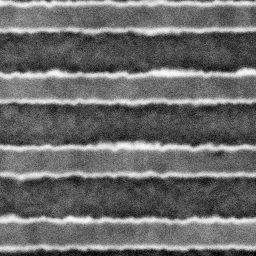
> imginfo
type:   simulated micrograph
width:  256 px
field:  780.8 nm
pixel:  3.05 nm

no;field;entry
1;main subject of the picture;lines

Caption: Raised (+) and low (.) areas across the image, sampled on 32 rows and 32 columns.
++++++++++++++++++++++++++++++++
++++++++++++++++++++++++++++++++
++++++++++++++++++++++++++++++++
++++++++++++++++++++++++++++++++
................................
................................
................................
................................
................................
++++++++++++++++++++++++++++++++
++++++++++++++++++++++++++++++++
++++++++++++++++++++++++++++++++
++++++++++++++++++++++++++++++++
................................
................................
................................
................................
................................
++++++++++++++++++++++++.+++++++
++++++++++++++++++++++++++++++++
++++++++++++++++++++++++++++++++
++++++++++++++++++++++++++++++++
................................
................................
................................
................................
................................
++++++++++.++++.+++++..+++++++++
++++++++++++++++++++++++++++++++
++++++++++++++++++++++++++++++++
++++++++++++++++++++++++++++++++
................................